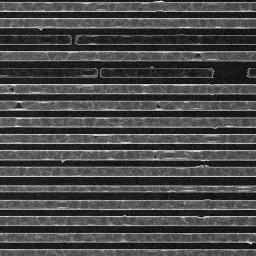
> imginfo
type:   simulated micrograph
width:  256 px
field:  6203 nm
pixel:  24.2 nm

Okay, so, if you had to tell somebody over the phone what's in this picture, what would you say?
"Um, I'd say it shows parallel lines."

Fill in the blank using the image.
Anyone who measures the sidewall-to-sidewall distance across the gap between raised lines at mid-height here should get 0.161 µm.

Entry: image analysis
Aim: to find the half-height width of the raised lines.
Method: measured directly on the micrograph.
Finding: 239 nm